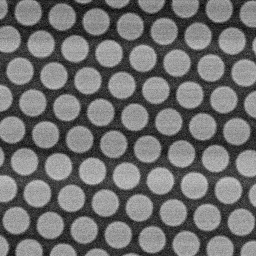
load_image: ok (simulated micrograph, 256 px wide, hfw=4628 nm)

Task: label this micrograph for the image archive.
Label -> an array of small figures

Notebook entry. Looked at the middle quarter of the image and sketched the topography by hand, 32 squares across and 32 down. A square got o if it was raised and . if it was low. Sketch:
...........o.....ooooo...oooooo.
....oooo..........ooo....oooooo.
o..oooooo....ooo...........ooo..
o..oooooo...ooooo.....oo........
...oooooo..ooooooo...oooo.......
...oooooo..ooooooo..oooooo...ooo
....oooo...ooooooo..oooooo...ooo
............ooooo...oooooo..oooo
ooo...........o.....oooooo..oooo
oooo...oooo...........oo.....ooo
oooo..oooooo....ooo...........oo
oooo..oooooo...ooooo.....oo.....
ooo...oooooo...oooooo...ooooo...
ooo...oooooo...oooooo..oooooo...
.......oooo....oooooo..oooooo...
...............ooooo...oooooo..o
..oooo..................ooooo...
.oooooo....ooo...........oo.....
.oooooo...ooooo....ooo..........
.oooooo..oooooo...oooooo....ooo.
.oooooo..ooooooo..oooooo...ooooo
..oooo....ooooo...oooooo..oooooo
..........ooooo...oooooo..oooooo
o..................oooo...oooooo
oo...oooo..................ooooo
oo..oooooo....oooo..........ooo.
oo..oooooo...ooooo....oooo......
o...oooooo...oooooo..oooooo....o
....oooooo..ooooooo..oooooo...oo
.....oooo....ooooo...oooooo...oo
.o............oooo...oooooo..ooo
oooo..................oooo....oo